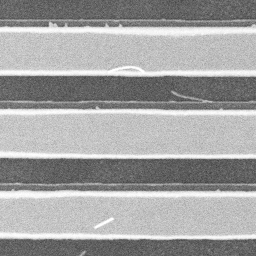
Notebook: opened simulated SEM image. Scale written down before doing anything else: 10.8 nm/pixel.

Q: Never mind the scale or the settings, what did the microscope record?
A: lines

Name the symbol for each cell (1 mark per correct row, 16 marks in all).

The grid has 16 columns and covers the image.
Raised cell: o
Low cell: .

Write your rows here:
................
................
oooooooooooooooo
oooooooooooooooo
oooooooooooooooo
................
................
oooooooooooooooo
oooooooooooooooo
oooooooooooooooo
................
................
oooooooooooooooo
oooooooooooooooo
oooooooooooooooo
................